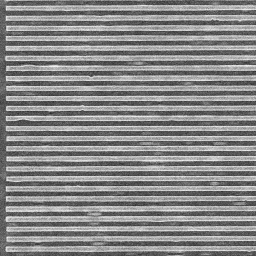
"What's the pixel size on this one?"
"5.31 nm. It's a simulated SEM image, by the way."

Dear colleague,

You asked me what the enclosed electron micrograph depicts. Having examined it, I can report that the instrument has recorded parallel lines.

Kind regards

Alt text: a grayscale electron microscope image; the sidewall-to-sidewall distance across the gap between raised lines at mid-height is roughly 27.9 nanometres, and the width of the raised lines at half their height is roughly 25.2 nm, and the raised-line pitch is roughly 53.3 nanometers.